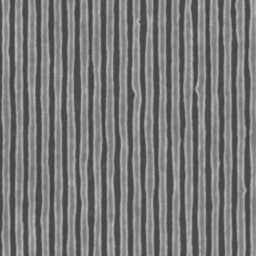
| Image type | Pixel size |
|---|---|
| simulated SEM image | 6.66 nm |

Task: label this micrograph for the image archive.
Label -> parallel lines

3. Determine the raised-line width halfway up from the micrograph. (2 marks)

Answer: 45.8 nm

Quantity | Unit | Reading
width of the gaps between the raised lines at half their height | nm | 39.2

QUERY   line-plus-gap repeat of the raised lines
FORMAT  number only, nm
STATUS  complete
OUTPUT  86.9